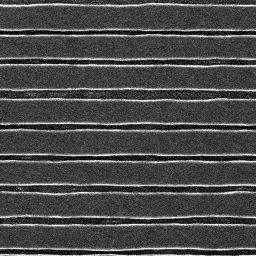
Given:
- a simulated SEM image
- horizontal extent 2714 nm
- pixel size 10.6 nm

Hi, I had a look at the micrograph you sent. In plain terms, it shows parallel lines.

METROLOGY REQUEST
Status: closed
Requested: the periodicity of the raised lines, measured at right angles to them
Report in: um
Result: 0.332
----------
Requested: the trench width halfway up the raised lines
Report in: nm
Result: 71.6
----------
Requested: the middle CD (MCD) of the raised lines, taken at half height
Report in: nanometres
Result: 261